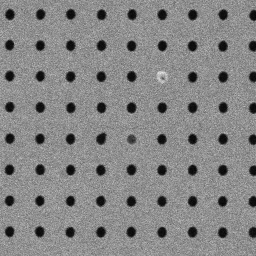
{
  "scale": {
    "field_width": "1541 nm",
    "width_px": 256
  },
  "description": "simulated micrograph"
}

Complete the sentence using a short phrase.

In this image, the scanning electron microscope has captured a regular array of holes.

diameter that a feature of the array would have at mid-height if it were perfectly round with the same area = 62.3 nm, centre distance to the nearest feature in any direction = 30.4 px